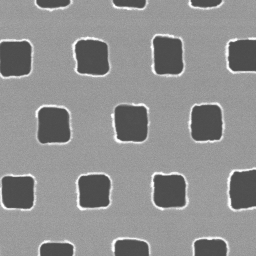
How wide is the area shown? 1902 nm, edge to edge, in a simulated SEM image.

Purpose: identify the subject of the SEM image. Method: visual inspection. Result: a regular array of holes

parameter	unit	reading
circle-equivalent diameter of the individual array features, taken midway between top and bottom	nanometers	268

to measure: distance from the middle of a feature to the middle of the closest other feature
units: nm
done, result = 560